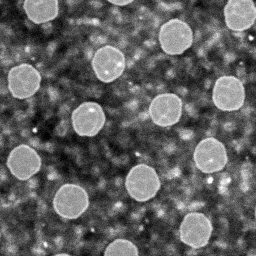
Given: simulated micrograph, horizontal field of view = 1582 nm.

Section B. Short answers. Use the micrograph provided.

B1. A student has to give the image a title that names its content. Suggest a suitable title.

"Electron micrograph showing a regular array of raised bodies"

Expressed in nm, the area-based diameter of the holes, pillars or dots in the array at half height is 204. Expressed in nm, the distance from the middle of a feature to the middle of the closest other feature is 395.